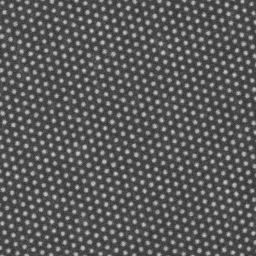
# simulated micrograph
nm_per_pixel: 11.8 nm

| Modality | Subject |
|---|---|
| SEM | a regular array of raised bodies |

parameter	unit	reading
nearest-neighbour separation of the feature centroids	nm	107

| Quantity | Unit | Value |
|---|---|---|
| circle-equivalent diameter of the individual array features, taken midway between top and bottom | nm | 45.9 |